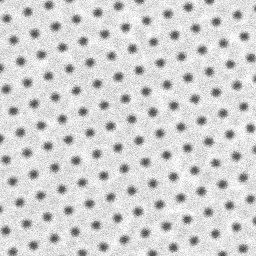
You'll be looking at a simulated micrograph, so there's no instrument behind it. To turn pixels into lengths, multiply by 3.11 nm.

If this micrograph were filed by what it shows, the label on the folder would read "a regular array of holes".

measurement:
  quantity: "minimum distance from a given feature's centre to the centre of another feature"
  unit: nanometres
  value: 68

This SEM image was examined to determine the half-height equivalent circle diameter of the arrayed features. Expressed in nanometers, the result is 30.8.